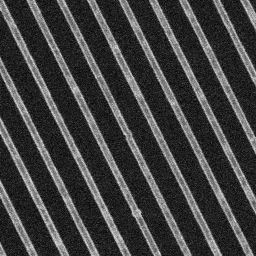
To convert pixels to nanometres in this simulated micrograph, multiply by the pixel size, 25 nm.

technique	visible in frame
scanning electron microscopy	parallel lines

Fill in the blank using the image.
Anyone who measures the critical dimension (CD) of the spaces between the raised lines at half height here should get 556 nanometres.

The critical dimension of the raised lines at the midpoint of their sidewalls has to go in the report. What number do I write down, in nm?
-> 145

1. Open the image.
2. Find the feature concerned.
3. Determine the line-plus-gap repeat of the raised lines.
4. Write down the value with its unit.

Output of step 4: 0.688 micrometres